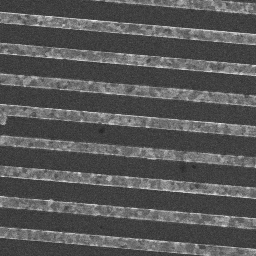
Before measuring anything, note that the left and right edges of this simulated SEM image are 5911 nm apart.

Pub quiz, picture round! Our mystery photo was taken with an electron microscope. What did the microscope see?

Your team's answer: parallel lines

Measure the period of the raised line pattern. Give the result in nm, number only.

706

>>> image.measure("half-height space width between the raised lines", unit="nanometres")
474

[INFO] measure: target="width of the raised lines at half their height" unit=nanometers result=247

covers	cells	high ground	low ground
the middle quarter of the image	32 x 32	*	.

.....................***********
................................
................................
................................
*******.........................
*******************.............
.*****************************..
.............*******************
........................********
................................
................................
................................
************....................
***********************.........
......**************************
.................***************
.............................***
................................
................................
**..............................
*************...................
*************************.......
..........**********************
.....................***********
................................
................................
................................
*******.........................
******************..............
.*****************************..
............********************
........................********